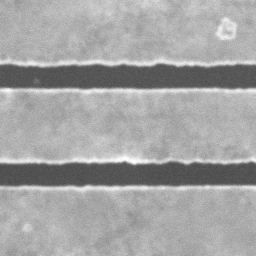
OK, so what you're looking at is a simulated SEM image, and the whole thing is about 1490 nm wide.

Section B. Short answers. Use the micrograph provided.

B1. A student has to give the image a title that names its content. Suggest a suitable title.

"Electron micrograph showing lines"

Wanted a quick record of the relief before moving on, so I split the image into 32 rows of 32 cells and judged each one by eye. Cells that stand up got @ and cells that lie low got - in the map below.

@@@@@@@@@@@@@@@@@@@@@@@@@@@@@@@@
@@@@@@@@@@@@@@@@@@@@@@@@@@@@@@@@
@@@@@@@@@@@@@@@@@@@@@@@@@@@@@@@@
@@@@@@@@@@@@@@@@@@@@@@@@@@@@@@@@
@@@@@@@@@@@@@@@@@@@@@@@@@@@@@@@@
@@@@@@@@@@@@@@@@@@@@@@@@@@@@@@@@
@@@@@@@@@@@@@@@@@@@@@@@@@@@@@@@@
@@@@@@@@@@@@@@@@@@@@@@@@@@@@@@@@
--------------------------------
--------------------------------
--------------------------------
@@@@@@@@@@@@@@@@@@@@@@@@@@@@@@@@
@@@@@@@@@@@@@@@@@@@@@@@@@@@@@@@@
@@@@@@@@@@@@@@@@@@@@@@@@@@@@@@@@
@@@@@@@@@@@@@@@@@@@@@@@@@@@@@@@@
@@@@@@@@@@@@@@@@@@@@@@@@@@@@@@@@
@@@@@@@@@@@@@@@@@@@@@@@@@@@@@@@@
@@@@@@@@@@@@@@@@@@@@@@@@@@@@@@@@
@@@@@@@@@@@@@@@@@@@@@@@@@@@@@@@@
@@@@@@@@@@@@@@@@@@@@@@@@@@@@@@@@
--------------------------------
--------------------------------
--------------------------------
@@@@@@@@@@@@@@@@@@@@@@@@@@@@@@@@
@@@@@@@@@@@@@@@@@@@@@@@@@@@@@@@@
@@@@@@@@@@@@@@@@@@@@@@@@@@@@@@@@
@@@@@@@@@@@@@@@@@@@@@@@@@@@@@@@@
@@@@@@@@@@@@@@@@@@@@@@@@@@@@@@@@
@@@@@@@@@@@@@@@@@@@@@@@@@@@@@@@@
@@@@@@@@@@@@@@@@@@@@@@@@@@@@@@@@
@@@@@@@@@@@@@@@@@@@@@@@@@@@@@@@@
@@@@@@@@@@@@@@@@@@@@@@@@@@@@@@@@